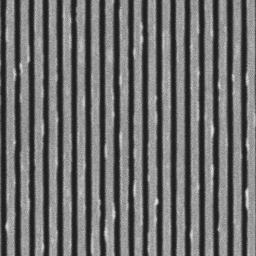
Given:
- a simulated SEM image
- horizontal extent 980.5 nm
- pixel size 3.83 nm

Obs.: parallel lines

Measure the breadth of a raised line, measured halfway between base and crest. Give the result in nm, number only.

33.5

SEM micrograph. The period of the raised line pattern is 0.0542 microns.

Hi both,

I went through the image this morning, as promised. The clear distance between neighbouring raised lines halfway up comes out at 20.1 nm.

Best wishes